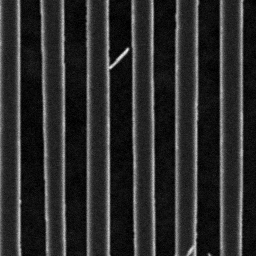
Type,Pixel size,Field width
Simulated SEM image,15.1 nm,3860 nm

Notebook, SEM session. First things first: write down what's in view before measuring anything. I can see lines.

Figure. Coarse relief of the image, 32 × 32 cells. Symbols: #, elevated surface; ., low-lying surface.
##...###...##....##...###...##..
##...###...##....##...###...##..
##...###...##....##...###...##..
##...###...##....##...###...##..
##...###...##....##...###...##..
##...###...##....##...###...##..
##...###...##....##...###...##..
##...###...##....##...###...##..
##...###...##....##...###...##..
##...###...###...##...###...##..
##...###...###...##...###...##..
##...###...###...##...###...##..
##...###...###...##...###...##..
##...###...###...##...###...##..
##...###...###...##...###...##..
##...###...###...##...###...##..
##....##...###...##...###...##..
##....##...###...##...###...##..
##....##...###...##...###...##..
##....##...###...##...###...##..
##....##...###...##...###...##..
##....##...###...##...###...##..
##....##...###...##...###...##..
##....##...###...##...###...##..
##....##...###...##...###...##..
##....##...###...##...###...##..
##....##...###...##...###...##..
##....##...###...##...##....##..
##....##...###...##...##....##..
##....##...###...##...##....##..
##....##...###...##...##....##..
###...##...###...##...##....##..